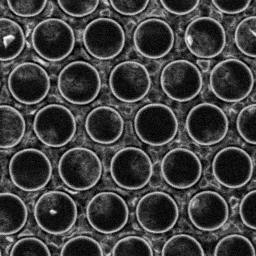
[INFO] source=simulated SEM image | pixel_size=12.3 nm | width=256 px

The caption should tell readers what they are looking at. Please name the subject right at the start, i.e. a regular array of raised bodies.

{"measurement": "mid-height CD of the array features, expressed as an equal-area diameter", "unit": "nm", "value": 503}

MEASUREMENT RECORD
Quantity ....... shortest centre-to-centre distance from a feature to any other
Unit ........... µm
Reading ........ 0.613